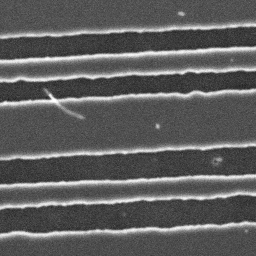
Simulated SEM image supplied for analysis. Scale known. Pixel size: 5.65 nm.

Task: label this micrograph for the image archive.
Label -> lines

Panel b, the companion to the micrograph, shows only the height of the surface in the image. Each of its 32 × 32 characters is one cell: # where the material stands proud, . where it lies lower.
################################
################################
################################
###########################.....
###.............................
................................
....................############
...#############################
################################
###############.................
................................
........................#..#####
......##########################
################################
################################
################################
################################
################################
###########################.....
########........................
................................
................................
..................##############
################################
#############################...
##########......................
................................
................................
......................##########
################################
################################
################################